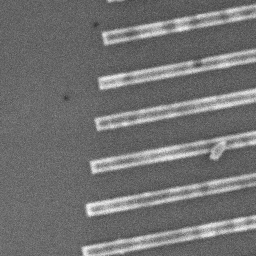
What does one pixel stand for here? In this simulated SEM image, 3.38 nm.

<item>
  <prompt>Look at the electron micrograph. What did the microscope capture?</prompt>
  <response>parallel lines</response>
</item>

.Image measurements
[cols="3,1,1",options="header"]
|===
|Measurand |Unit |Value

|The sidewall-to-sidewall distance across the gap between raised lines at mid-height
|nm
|101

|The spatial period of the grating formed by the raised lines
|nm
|140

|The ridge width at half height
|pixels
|10.7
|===